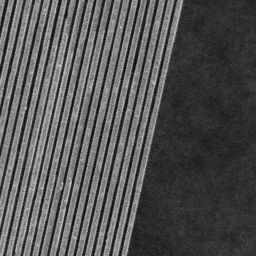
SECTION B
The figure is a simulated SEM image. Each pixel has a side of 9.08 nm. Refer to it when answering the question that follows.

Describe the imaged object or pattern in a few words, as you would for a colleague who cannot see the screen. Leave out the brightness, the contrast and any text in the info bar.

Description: parallel lines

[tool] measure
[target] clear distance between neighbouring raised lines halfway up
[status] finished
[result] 35.4 nm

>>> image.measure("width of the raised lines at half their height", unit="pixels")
4.77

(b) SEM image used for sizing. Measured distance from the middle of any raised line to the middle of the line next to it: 78.7 nm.